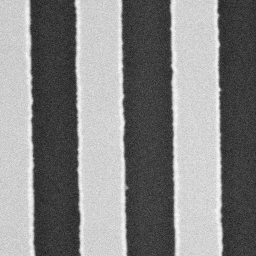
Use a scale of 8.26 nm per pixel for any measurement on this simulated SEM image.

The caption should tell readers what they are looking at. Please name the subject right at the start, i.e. lines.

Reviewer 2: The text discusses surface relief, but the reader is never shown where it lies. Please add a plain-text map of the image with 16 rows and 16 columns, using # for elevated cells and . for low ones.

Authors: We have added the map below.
##...###...###..
##...###...###..
##...###...###..
##...###...###..
##...###...###..
##...###...###..
##...###...###..
##...###...###..
##...###...###..
##...###...###..
##...###...###..
##...###...###..
##...###...###..
##...###...###..
##...###...###..
##...###...###..